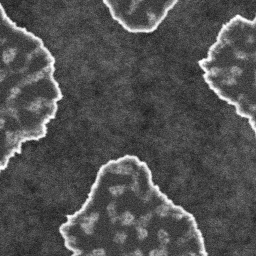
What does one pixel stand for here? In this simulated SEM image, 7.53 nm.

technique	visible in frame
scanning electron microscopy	raised bodies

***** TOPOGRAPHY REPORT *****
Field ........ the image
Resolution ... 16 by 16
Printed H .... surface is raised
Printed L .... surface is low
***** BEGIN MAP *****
LLLLLLLHHHHLLLLL
HLLLLLLLHHLLLLHH
HHLLLLLLLLLLLLHH
HHHLLLLLLLLLLHHH
HHHLLLLLLLLLLHHH
HHHHLLLLLLLLLHHH
HHHHLLLLLLLLLLLH
HHHLLLLLLLLLLLLL
HHLLLLLLLLLLLLLL
HLLLLLLLLLLLLLLL
LLLLLLLHHLLLLLLL
LLLLLLHHHHLLLLLL
LLLLLLHHHHLLLLLL
LLLLLHHHHHHHLLLL
LLLLHHHHHHHHLLLL
LLLLHHHHHHHHHLLL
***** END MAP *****